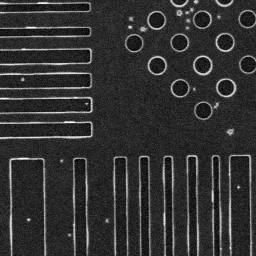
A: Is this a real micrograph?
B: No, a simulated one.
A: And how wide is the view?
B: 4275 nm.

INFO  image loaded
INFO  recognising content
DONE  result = groups of lines, slits or small figures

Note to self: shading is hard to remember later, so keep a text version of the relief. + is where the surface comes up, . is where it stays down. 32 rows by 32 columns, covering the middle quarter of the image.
+++++++++++++++++++++.....++++++
+++++++++++++++++++++....+++++++
......++++++++++++++++..++++++++
.......+++++++++++++++++++++++++
.......+++++++++++++++++++++...+
.......++++++++++++++++++++....+
+++++++++++++++++++++++++++....+
++++++++++++++++++++++++++++...+
......++++++++++++++++++++++++++
.......+++++++++++++++++++++++++
.......+++++++++++++++++++++++++
.......+++++++++++++++++++++++++
++++++++++++++++++++++++++++++++
++++++++++++++++++++++++++++++++
++++++++++++++++++++++++++++++++
.......+++++++++++++++++++++++++
.......+++++++++++++++++++++++++
.......+++++++++++++++++++++++++
+...++++++++++++++++++++++++++++
++++++++++++++++++++++++++++++++
++++++++++++++++++++++++++++++++
++++++++++++++++++++++++++++++++
++++++++++++++++++++++++++++++++
+++..++++++++..++++..++++..++++.
++...++++++++...+++..++++..++++.
++....+++++++...+++..++++..++++.
++....+++++++...+++..++++..++++.
++....+++++++...+++..++++..++++.
++....+++++++...+++..++++..++++.
++....+++++++...+++..++++..++++.
++....+++++++...+++..++++..++++.
++....+++++++...+++..++++..++++.